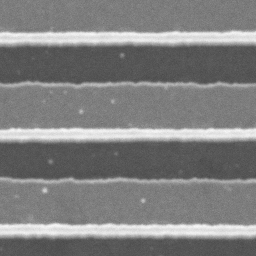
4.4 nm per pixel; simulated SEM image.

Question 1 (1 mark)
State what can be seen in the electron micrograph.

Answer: lines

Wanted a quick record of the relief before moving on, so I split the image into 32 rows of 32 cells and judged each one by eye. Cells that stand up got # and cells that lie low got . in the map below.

################################
################################
################################
################################
################################
................................
................................
................................
................................
................................
..####....#..########.##...#....
################################
################################
################################
################################
################################
################################
..#.............................
................................
................................
................................
................................
##.##...#....####.......##......
################################
################################
################################
################################
################################
################################
............................#..#
................................
................................